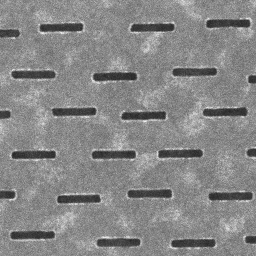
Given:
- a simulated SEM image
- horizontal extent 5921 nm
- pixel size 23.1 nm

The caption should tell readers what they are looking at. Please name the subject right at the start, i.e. a regular array of holes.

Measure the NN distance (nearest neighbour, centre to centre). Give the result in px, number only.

54.5